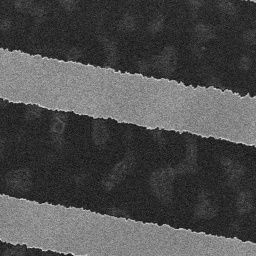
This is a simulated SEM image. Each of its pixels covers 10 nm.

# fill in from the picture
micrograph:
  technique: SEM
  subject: one or a few lines or trenches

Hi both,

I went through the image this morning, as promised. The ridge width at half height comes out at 480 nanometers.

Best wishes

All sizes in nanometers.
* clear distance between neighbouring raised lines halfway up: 942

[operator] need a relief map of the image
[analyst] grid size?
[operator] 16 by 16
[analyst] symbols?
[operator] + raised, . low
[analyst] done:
................
................
................
++..............
+++++++.........
+++++++++++++...
..++++++++++++++
.......+++++++++
.............+++
................
................
................
++..............
+++++++.........
++++++++++++....
..++++++++++++++